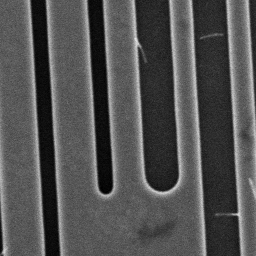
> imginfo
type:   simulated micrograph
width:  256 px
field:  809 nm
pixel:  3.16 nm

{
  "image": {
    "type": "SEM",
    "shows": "groups of lines, slits or small figures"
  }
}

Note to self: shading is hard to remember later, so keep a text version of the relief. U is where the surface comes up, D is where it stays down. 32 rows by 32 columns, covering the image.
UUUUDDUUUUUDDUUUUDDDDUUUDDDDUUUD
UUUUDDUUUUUDDUUUUDDDDUUUDDDDUUUD
UUUUDDUUUUUDDUUUUDDDDUUUDDDDUUUD
UUUUDDUUUUUDDUUUUDDDDUUUDDDDDUUD
UUUUDDUUUUUDDUUUUDDDDUUUDDDDDUUD
UUUUDDUUUUUDDUUUUDDDDUUUDDDDDUUD
UUUUDDUUUUUDDUUUUDDDDDUUDDDDDUUD
UUUUDDUUUUUDDUUUUDDDDDUUDDDDDUUD
UUUUDDUUUUUDDUUUUDDDDDUUDDDDDUUU
UUUUDDUUUUUDDUUUUDDDDDUUDDDDDUUU
UUUUDDUUUUUUDDUUUDDDDDUUDDDDDUUU
UUUUDDUUUUUUDDUUUDDDDDUUUDDDDUUU
UUUUDDDUUUUUDDUUUDDDDDUUUDDDDUUU
UUUUUDDUUUUUDDUUUUDDDDUUUDDDDUUU
UUUUUDDUUUUUDDUUUUDDDDUUUDDDDUUU
UUUUUDDUUUUUDDUUUUDDDDUUUDDDDUUU
UUUUUDDUUUUUDDUUUUDDDDUUUDDDDUUU
UUUUUDDUUUUUDDUUUUDDDDUUUDDDDUUU
UUUUUDDUUUUUDDUUUUDDDDUUUDDDDUUU
UUUUUDDUUUUUDDUUUUDDDDUUUDDDDUUU
UUUUUDDUUUUUDDUUUUDDDDUUUDDDDUUU
UUUUUDDUUUUUDDUUUUDDDDUUUDDDDDUU
UUUUUDDUUUUUDDUUUUDDDDUUUDDDDDUU
UUUUUDDUUUUUDDUUUUUDDDUUUDDDDDUU
UUUUUDDUUUUUUUUUUUUUUUUUUDDDDDUU
UUUUUDDUUUUUUUUUUUUUUUUUUDDDDDUU
UUUUUDDUUUUUUUUUUUUUUUUUUDDDDDUU
UUUUUDDUUUUUUUUUUUUUUUUUUDDDDDUU
UUUUUDDUUUUUUUUUUUUUUUUUUUDDDDUU
UUUUUUDUUUUUUUUUUUUUUUUUUUDDDDUU
UUUUUUDDUUUUUUUUUUUUUUUUUUDDDDUU
UUUUUUDDUUUUUUUUUUUUUUUUUUDDDDUU